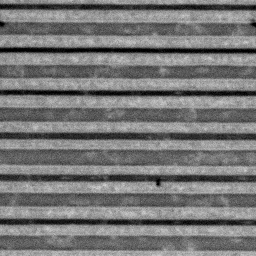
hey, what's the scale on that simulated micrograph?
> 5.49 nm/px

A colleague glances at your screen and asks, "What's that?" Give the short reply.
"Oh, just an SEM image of parallel lines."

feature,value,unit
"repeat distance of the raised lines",118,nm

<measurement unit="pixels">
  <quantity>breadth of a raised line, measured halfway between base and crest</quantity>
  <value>11.5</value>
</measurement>